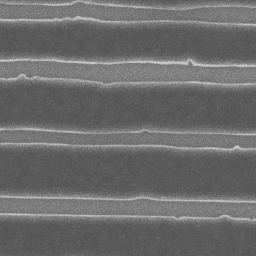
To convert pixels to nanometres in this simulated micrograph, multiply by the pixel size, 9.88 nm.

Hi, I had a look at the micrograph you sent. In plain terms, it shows one or a few lines or trenches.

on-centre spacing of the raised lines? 646 nm